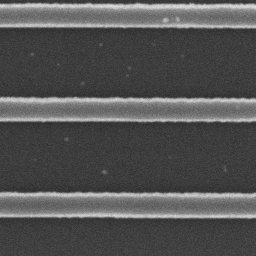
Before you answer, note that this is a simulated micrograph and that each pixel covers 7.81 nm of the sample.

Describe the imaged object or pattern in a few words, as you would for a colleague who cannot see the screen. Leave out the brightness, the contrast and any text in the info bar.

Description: lines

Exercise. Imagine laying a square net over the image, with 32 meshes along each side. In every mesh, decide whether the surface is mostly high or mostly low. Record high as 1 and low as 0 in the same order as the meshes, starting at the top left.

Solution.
00000000000000000000000000000000
11111111111111111111111111111111
11111111111111111111111111111111
00000000000000000000000000000000
00000000000000000000000000000000
00000000000000000000000000000000
00000000000000000000000000000000
00000000000000000000000000000000
00000000000000000000000000000000
00000000000000000000000000000000
00000000000000000000000000000000
00000000000000000000000000000000
11111111111111111111111111111111
11111111111111111111111111111111
11111111111111111111111111111111
00000000000000000000000000000000
00000000000000000000000000000000
00000000000000000000000000000000
00000000000000000000000000000000
00000000000000000000000000000000
00000000000000000000000000000000
00000000000000000000000000000000
00000000000000000000000000000000
00000000000000000000000000000000
11111111111111111111111111111111
11111111111111111111111111111111
11111111111111111111111111111111
00000000000000000000000000000000
00000000000000000000000000000000
00000000000000000000000000000000
00000000000000000000000000000000
00000000000000000000000000000000